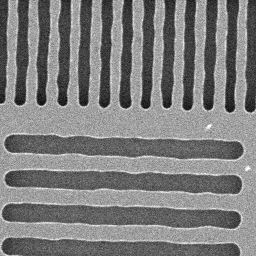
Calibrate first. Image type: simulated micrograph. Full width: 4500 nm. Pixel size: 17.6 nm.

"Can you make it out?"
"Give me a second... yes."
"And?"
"groups of lines, slits or small figures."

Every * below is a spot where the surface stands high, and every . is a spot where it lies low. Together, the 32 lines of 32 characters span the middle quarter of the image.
..*....**...**...**...***...**..
.**....**...**...**...**...***..
.**....**...**...**...**....**..
..*....**...**...**...**....**..
.**....**...**...**...**....*...
.***...**...**...**...**...***..
.***..***...**...**...**...***..
.***..***...**...**...**...***..
.***..***...**...**...**...***..
.***..***...**...**...***..**...
*********..***...**...***..**...
******************************..
********************************
********************************
********************************
********************************
********************************
********************************
....................****...*****
................................
................................
................................
................................
****************..********......
********************************
********************************
********************************
................................
................................
................................
................................
*.......****....................